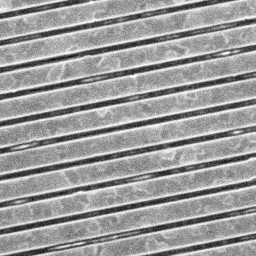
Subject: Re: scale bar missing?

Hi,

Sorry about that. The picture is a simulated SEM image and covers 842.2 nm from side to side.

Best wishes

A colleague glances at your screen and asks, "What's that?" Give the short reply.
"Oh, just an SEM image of parallel lines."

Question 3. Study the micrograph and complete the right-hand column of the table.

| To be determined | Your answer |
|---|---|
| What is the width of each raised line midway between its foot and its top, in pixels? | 19.7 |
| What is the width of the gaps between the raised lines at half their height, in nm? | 22.7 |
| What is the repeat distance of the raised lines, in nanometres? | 87.3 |